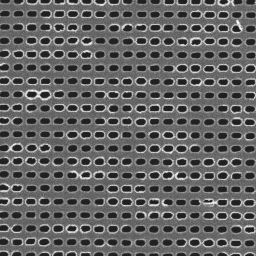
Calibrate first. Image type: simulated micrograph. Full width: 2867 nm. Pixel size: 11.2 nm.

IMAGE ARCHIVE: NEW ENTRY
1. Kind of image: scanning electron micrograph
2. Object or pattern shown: a regular array of holes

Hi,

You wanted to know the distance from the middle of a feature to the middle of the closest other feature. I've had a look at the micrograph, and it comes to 0.147 um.